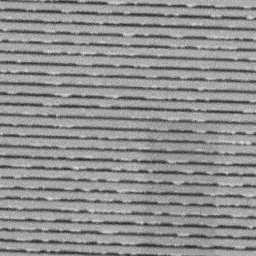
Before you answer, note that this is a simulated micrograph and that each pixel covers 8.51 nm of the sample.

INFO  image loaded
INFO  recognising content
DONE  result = parallel lines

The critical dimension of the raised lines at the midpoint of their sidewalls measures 0.0627 µm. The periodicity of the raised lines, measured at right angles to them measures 88.9 nm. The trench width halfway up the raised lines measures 23.4 nm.